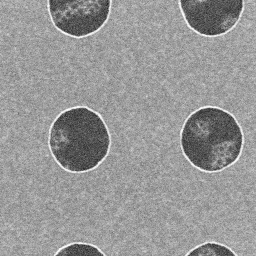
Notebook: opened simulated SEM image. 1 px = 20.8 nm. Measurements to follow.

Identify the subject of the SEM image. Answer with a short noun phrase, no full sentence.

holes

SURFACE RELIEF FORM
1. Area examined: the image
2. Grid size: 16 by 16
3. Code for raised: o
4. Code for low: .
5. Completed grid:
ooo....oooo....o
ooo...oooooo...o
oooooooooooooooo
oooooooooooooooo
oooooooooooooooo
oooooooooooooooo
oooooooooooooooo
ooo...oooooo...o
ooo....oooo....o
ooo....ooooo...o
oooo..oooooo..oo
oooooooooooooooo
oooooooooooooooo
oooooooooooooooo
oooooooooooooooo
oooo..oooooo..oo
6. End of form